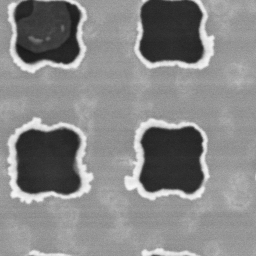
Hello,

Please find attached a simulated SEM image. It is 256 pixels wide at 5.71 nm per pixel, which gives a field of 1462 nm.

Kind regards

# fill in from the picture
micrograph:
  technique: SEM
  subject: holes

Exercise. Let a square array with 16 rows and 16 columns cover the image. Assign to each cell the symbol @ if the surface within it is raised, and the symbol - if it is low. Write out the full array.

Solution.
@----@@@@---@@@@
@----@@@@----@@@
@----@@@@----@@@
@----@@@@----@@@
@@@@@@@@@@@@@@@@
@@@@@@@@@@@@@@@@
@@@@@@@@@@@@@@@@
@@@@@@@@@@@@@@@@
@----@@@@----@@@
@----@@@@----@@@
@----@@@@----@@@
@----@@@@----@@@
@@@@@@@@@@@@@@@@
@@@@@@@@@@@@@@@@
@@@@@@@@@@@@@@@@
@@@@@@@@@@@@@@@@